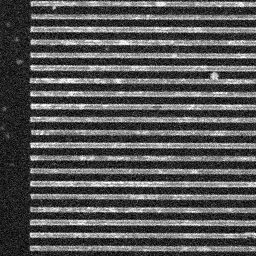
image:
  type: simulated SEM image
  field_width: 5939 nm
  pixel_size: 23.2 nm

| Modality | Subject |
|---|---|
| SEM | parallel lines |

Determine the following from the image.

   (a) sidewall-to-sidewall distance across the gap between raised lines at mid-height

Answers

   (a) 203 nm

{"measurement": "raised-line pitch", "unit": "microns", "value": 0.299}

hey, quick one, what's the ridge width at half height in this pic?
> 102 nm